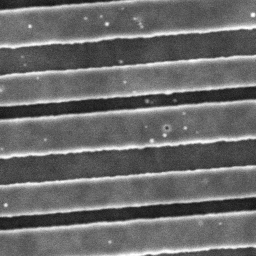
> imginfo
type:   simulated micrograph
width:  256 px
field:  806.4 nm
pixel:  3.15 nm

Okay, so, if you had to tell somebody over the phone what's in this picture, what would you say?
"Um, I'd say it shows lines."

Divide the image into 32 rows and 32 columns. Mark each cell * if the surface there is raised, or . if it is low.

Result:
............********************
********************************
********************************
********************************
*******************.............
******..........................
................................
.........................*******
............********************
********************************
********************************
**********************..........
**********......................
....................************
.......*************************
********************************
********************************
******************************..
****************................
**..............................
................................
.....................***********
..........**********************
********************************
********************************
********************............
*******.......................**
...................*************
......**************************
********************************
********************************
**********************..........